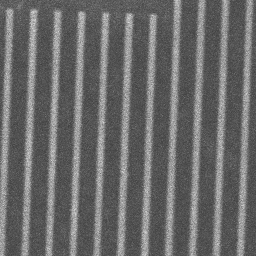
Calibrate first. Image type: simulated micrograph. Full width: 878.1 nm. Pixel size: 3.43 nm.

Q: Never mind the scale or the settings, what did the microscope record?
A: parallel lines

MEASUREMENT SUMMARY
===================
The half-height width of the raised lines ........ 5.36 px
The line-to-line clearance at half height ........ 0.0642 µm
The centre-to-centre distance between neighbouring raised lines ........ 82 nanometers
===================